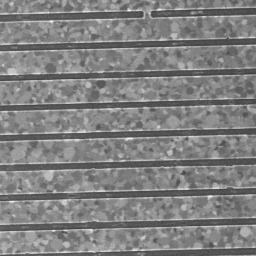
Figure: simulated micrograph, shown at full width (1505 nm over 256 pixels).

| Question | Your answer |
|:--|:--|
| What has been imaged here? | parallel lines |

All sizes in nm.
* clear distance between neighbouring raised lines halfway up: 39.7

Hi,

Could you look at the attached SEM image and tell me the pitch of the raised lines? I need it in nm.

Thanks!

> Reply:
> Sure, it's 176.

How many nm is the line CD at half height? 134